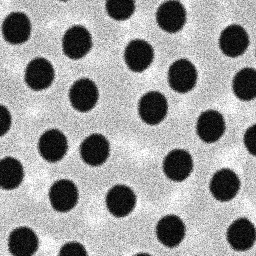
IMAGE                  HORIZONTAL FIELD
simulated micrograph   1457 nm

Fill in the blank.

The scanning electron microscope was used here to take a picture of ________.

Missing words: a regular array of holes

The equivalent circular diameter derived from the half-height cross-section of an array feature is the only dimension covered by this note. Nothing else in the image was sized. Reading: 182 nm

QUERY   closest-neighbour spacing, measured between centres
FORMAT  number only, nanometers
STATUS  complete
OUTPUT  284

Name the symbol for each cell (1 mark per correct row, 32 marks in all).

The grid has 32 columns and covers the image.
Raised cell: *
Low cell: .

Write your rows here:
*************....***...*********
*************....***...*********
....**********..****...*********
....*****..*********...*****..**
....****...****************....*
*..*****....****...********....*
********...*****...*********...*
****..**********...***..********
***....*********..***...******.*
***....**************....****...
***...***...*********...*****...
*********...*******.**..*****...
*********...*****....*********..
.********...*****....***********
.****************....****...****
.*****************..****....****
.*****..*****************...***.
*****...**...************..***..
*****...**....*****************.
*****...**....*******...********
...********..*******....********
...*****************....***..***
...****..************..***....**
..****....****..**********....**
******....***....**********..***
******....***....***************
*******.******..****************
********************...******..*
**..***************....******...
*....***************...*****....
*....***..**********..*******...
*...***....*********************